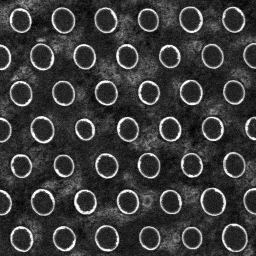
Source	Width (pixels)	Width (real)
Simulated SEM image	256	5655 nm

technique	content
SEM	a regular array of raised bodies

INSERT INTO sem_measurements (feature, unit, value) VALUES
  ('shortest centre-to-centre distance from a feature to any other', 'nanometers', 927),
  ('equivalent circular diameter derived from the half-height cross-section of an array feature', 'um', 0.507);